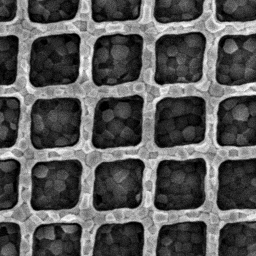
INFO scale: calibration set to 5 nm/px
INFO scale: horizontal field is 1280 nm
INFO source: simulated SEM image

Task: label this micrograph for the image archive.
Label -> a regular array of holes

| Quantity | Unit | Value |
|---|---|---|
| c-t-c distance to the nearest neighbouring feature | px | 62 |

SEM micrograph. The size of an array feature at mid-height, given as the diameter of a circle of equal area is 277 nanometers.